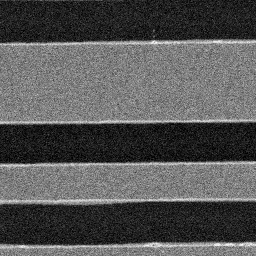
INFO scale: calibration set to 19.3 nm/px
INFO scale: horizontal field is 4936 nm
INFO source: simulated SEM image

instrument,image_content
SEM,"lines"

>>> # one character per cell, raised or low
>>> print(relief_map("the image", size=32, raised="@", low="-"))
--------------------------------
--------------------------------
--------------------------------
--------------------------------
--------------------------------
------@-@@@@@@@@@@@@@@@@@@@@@@@@
@@@@@@@@@@@@@@@@@@@@@@@@@@@@@@@@
@@@@@@@@@@@@@@@@@@@@@@@@@@@@@@@@
@@@@@@@@@@@@@@@@@@@@@@@@@@@@@@@@
@@@@@@@@@@@@@@@@@@@@@@@@@@@@@@@@
@@@@@@@@@@@@@@@@@@@@@@@@@@@@@@@@
@@@@@@@@@@@@@@@@@@@@@@@@@@@@@@@@
@@@@@@@@@@@@@@@@@@@@@@@@@@@@@@@@
@@@@@@@@@@@@@@@@@@@@@@@@@@@@@@@@
@@@@@@@@@@@@@@@@@@@@@@@@@@@@@@@@
--------------------------------
--------------------------------
--------------------------------
--------------------------------
--------------------------------
-------------------@@@@@@@@@@@@@
@@@@@@@@@@@@@@@@@@@@@@@@@@@@@@@@
@@@@@@@@@@@@@@@@@@@@@@@@@@@@@@@@
@@@@@@@@@@@@@@@@@@@@@@@@@@@@@@@@
@@@@@@@@@@@@@@@@@@@@@@@@@@@@@@@@
--------------------------------
--------------------------------
--------------------------------
--------------------------------
--------------------------------
-------------------@-------@@-@@
@@@@@@@@@@@@@@@@@@@@@@@@@@@@@@@@